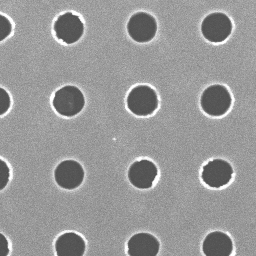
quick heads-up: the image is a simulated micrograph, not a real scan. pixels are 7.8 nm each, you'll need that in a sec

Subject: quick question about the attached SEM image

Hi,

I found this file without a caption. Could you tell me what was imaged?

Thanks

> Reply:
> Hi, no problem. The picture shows a regular array of holes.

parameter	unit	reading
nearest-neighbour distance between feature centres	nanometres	569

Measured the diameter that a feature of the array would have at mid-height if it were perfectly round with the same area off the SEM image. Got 225 nm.